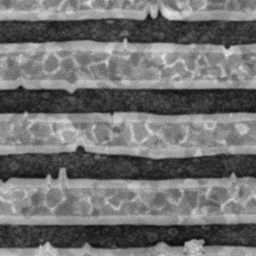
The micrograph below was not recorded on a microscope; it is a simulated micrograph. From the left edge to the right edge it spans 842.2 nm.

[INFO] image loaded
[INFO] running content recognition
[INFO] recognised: one or a few lines or trenches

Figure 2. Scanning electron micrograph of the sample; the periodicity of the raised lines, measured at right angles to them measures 0.223 µm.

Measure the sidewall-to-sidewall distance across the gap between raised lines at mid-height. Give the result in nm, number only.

110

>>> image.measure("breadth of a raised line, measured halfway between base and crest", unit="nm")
117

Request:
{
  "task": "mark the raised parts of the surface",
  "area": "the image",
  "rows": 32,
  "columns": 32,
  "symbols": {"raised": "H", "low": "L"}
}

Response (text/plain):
HHHHHHHHHHHHHHHHHHHHHHHHHHHHHHHH
HHHHHHHHHHHHHHHHHHLLHHHHHHHHHHHH
LLLLLLLLLLLLLLLLLLLLLLLLLLLLLLLL
LLLLLLLLLLLLLLLLLLLLLLLLLLLLLLLL
LLLLLLLLLLLLLLLLLLLLLLLLLLLLLLLL
LLLLLLLLLLLLLLLLLLLLLLLLLLLLLLLL
HHHHHHHHHHHHHHHHHHHHHHHHHHHHHHHH
HHHHHHHHHHHHHHHHHHHHHHHHHHHHHHHH
HHHHHHHHHHHHHHHHHHHHHHHHHHHHHHHH
HHHHHHHHHHHHHHHHHHHHHHHHHHHHHHHH
HHLHHHHHHHLLLLHHHLLLLLLLLLLLLLLL
LLLLLLLLLLLLLLLLLLLLLLLLLLLLLLLL
LLLLLLLLLLLLLLLLLLLLLLLLLLLLLLLL
LLLLLLLLLLLLLLLLLLLLLLLLLLLLLLLL
LLLHLLLLLLLLLLLLLLLLLLLLLLLLLLLL
HHHHHHHHHHHHHHHHHHHHHHHHHHHHHHHH
HHHHHHHHHHHHHHHHHHHHHHHHHHHHHHHH
HHHHHHHHHHHHHHHHHHHHHHHHHHHHHHHH
HHHHHHHHHLLHHHHHHHHHHHHHHHHHHHHH
LLLLLLLLLLLLLLLLLLLLLLLLLLLLLLLL
LLLLLLLLLLLLLLLLLLLLLLLLLLLLLLLL
LLLLLLLLLLLLLLLLLLLLLLLLLLLLLLLL
LLLLLLLHLLLLLLLLLLLLLLLLLLLLLHLL
LHHHHHHHHHHHHHHHHHHHHHHHHHHHHHHH
HHHHHHHHHHHHHHHHHHHHHHHHHHHHHHHH
HHHHHHHHHHHHHHHHHHHHHHHHHHHHHHHH
HHHHHHHHHHHHHHHHHHHHHHHHHHHHHHHH
LLLLLLLLHHHHLHLLLLLLLLLLLLLLLLLL
LLLLLLLLLLLLLLLLLLLLLLLLLLLLLLLL
LLLLLLLLLLLLLLLLLLLLLLLLLLLLLLLL
LLLLLLLLLLLLLLLLLLLLLLLHHLLLLLLL
LLLLLHHLLLHHLLLLLLLHHHHHHHHHHHHH